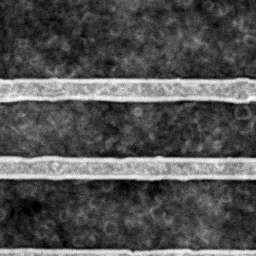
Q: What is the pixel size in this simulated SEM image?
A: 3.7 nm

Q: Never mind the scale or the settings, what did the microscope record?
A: one or a few lines or trenches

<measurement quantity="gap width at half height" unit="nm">249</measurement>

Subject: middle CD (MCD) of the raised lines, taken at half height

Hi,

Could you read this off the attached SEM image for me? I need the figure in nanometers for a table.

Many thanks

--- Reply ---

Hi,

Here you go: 64.2